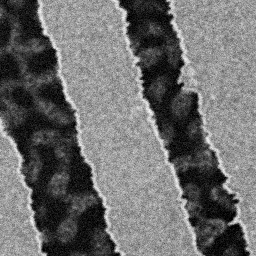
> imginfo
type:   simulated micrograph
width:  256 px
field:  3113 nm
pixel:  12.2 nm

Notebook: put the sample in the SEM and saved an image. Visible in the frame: one or a few lines or trenches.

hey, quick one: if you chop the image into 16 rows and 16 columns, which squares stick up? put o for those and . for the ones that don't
..oooooo...ooooo
...ooooo...ooooo
...ooooo...ooooo
....oooo....oooo
....ooooo..ooooo
....ooooo...oooo
....ooooo...oooo
.....ooooo...ooo
.....ooooo...ooo
o....ooooo...ooo
o.....ooooo...oo
oo....ooooo...oo
oo....ooooo....o
oo.....ooooo...o
oo.....ooooo.o.o
ooo....ooooo....